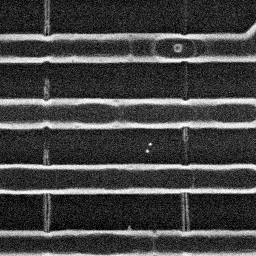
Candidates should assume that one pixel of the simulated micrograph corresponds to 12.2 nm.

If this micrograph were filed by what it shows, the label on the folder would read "wiring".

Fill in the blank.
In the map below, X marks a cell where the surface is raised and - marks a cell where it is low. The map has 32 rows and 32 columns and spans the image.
--------------------------------
--------------------------------
--------------------------------
--------------------------------
-------------------------------X
XXXXXXXXXXXXXXXXXXXXXXXXXXXXXXXX
XXXXXXXXXXXXXXXXXXXXXXXXXXXXXXXX
-XXXX---------------XXX---------
--------------------------------
--------------------------------
--------------------------------
--------------------------------
--------------------------------
XXXXXXXXXXXXXXXXXXXXXXXXXXXXXXXX
XXXXXXXXXXXXXXXXXXXXXXXXXXXXXXXX
XXXXXXXXXXXXXXXXXXXXXXXXXXXXXXXX
--------------------------------
--------------------------------
--------------------------------
--------------------------------
--------------------------------
XXXXXXXXXXXXXXXXXXXXXXXXXXXXXXXX
XXXXXXXXXXXXXXXXXXXXXXXXXXXXXXXX
XXXXXXXXXXXXXXXXXXXXXXXXXXXXXXXX
--------------------------------
--------------------------------
--------------------------------
--------------------------------
--------------------------------
XXXXXXXXXXXXXXXXXXXXXXXXXXXXXXXX
XXXXXXXXXXXXXXXXXXXXXXXXXXXXXXXX
XXXXXXXXXXXXXXXXXXXXXXXXXXXXXXXX